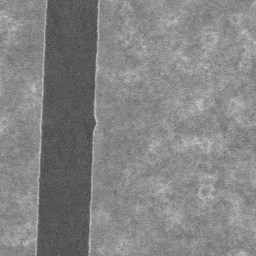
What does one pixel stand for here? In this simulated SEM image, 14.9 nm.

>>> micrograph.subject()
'one or a few lines or trenches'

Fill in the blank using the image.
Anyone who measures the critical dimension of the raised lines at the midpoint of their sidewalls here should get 800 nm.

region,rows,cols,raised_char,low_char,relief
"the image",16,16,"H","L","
LLLHHHLLLLLLLLLL
LLLHHHLLLLLLLLLL
LLLHHHLLLLLLLLLL
LLLHHHLLLLLLLLLL
LLLHHHLLLLLLLLLL
LLLHHHLLLLLLLLLL
LLLHHHLLLLLLLLLL
LLLHHHLLLLLLLLLL
LLLHHHLLLLLLLLLL
LLHHHHLLLLLLLLLL
LLHHHHLLLLLLLLLL
LLHHHHLLLLLLLLLL
LLHHHHLLLLLLLLLL
LLHHHHLLLLLLLLLL
LLHHHHLLLLLLLLLL
LLHHHHLLLLLLLLLL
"